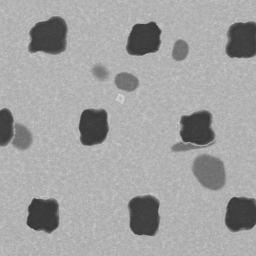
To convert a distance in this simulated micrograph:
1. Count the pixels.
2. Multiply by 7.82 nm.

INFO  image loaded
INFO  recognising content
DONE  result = holes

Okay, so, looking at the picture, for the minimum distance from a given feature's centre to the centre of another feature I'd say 792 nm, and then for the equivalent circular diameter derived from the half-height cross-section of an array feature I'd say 259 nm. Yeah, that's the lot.